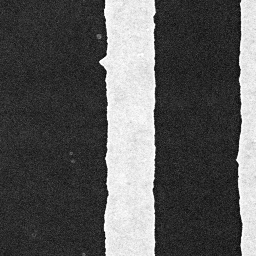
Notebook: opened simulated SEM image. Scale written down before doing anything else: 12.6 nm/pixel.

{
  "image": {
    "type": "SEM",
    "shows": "one or a few lines or trenches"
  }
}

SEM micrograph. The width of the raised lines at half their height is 590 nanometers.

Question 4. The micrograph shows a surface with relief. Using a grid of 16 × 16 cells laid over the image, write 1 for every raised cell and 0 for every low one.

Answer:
0000000111000001
0000000111000001
0000000111000001
0000000111000001
0000000111000001
0000000111000001
0000000111000001
0000000111000001
0000000111000001
0000000111000001
0000000111000001
0000000111000001
0000000111000001
0000000111000001
0000000111000001
0000000111000001